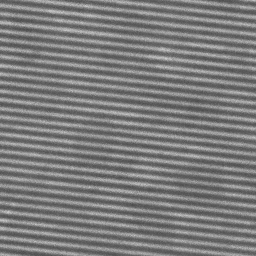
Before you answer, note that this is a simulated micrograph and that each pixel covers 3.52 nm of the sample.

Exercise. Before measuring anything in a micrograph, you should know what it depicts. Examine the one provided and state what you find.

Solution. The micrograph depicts parallel lines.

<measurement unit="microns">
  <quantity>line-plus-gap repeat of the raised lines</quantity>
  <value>0.0301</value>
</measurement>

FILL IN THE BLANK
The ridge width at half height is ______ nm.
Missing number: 7.9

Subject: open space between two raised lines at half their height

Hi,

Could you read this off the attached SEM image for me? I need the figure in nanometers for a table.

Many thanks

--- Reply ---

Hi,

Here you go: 23.2